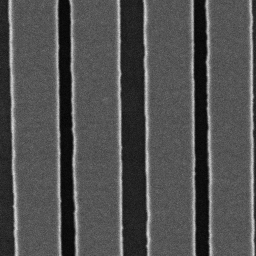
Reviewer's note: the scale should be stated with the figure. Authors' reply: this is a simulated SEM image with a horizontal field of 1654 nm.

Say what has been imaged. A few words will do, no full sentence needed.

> lines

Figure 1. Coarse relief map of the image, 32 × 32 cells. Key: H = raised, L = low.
LHHHHHHLLHHHHHHLLLHHHHHHLLHHHHHL
LHHHHHHLLHHHHHHLLLHHHHHHLLHHHHHH
LHHHHHHLLHHHHHHLLLHHHHHHLLHHHHHH
LHHHHHHLLHHHHHHLLLHHHHHHLLHHHHHH
LHHHHHHLLHHHHHHLLLHHHHHHLLHHHHHH
LHHHHHHLLHHHHHHLLLHHHHHHLLHHHHHH
LHHHHHHLLHHHHHHLLLHHHHHHLLHHHHHH
LHHHHHHLLHHHHHHLLLHHHHHHLLHHHHHH
LHHHHHHLLHHHHHHLLLHHHHHHLLHHHHHH
LHHHHHHLLHHHHHHLLLHHHHHHLLHHHHHH
LHHHHHHLLHHHHHHLLLHHHHHHLLHHHHHH
LHHHHHHLLHHHHHHLLLHHHHHHLLHHHHHH
LHHHHHHLLHHHHHHLLLHHHHHHLLHHHHHH
LHHHHHHLLHHHHHHLLLHHHHHHLLHHHHHH
LHHHHHHLLHHHHHHLLLHHHHHHLLHHHHHH
LLHHHHHLLHHHHHHLLLHHHHHHLLHHHHHH
LLHHHHHLLHHHHHHLLLHHHHHHLLHHHHHH
LLHHHHHLLHHHHHHLLLHHHHHHLLHHHHHH
LLHHHHHLLHHHHHHLLLHHHHHHLLHHHHHH
LLHHHHHLLHHHHHHLLLHHHHHHLLHHHHHH
LLHHHHHLLHHHHHHLLLHHHHHHLLHHHHHH
LLHHHHHLLHHHHHHLLLHHHHHHLLHHHHHH
LLHHHHHLLHHHHHHLLLHHHHHHLLHHHHHH
LLHHHHHLLHHHHHHLLLHHHHHHLLHHHHHH
LLHHHHHHLHHHHHHLLLHHHHHHLLHHHHHH
LLHHHHHHLHHHHHHLLLHHHHHHLLHHHHHH
LLHHHHHHLHHHHHHLLLHHHHHHLLHHHHHH
LLHHHHHHLHHHHHHLLLHHHHHHLLHHHHHH
LLHHHHHHLHHHHHHLLLHHHHHHLLHHHHHH
LLHHHHHHLHHHHHHLLLHHHHHHLLHHHHHH
LLHHHHHHLHHHHHHLLLHHHHHHLLHHHHHH
LLHHHHHHLLHHHHHLLLHHHHHHLLHHHHHH